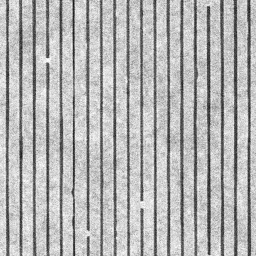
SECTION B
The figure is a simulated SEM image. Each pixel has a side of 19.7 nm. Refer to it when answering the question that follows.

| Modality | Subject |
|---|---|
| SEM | parallel lines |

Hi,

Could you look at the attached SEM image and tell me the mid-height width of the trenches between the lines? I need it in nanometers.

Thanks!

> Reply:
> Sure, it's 76.3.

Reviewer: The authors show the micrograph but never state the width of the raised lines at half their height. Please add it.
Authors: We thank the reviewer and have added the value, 189 nm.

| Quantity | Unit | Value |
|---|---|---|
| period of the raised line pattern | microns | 0.264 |